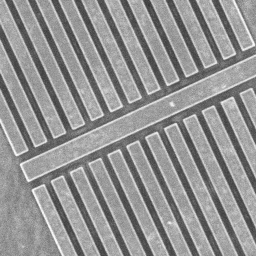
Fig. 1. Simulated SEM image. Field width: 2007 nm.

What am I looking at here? groups of lines, slits or small figures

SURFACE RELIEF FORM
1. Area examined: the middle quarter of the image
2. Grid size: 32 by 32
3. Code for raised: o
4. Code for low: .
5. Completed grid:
.ooo..oooo..oooo..ooo...ooo..ooo
.oooo..ooo...ooo..oooo..oooo..oo
..ooo..oooo..oooo..ooo...ooo..oo
..oooo..ooo...ooo..oooo..ooo....
..oooo..oooo..ooo...ooo..ooo....
o..ooo...ooo..oooo..oooo.......o
o..oooo..oooo..ooo...oo......ooo
oo..ooo...ooo..oooo........ooooo
oo..oooo..oooo..ooo......ooooooo
ooo..ooo..oooo..o......ooooooooo
ooo..oooo..ooo......oooooooooooo
oooo..ooo...o.....oooooooooooo..
.ooo..oooo......oooooooooooo....
.oooo..o......ooooooooooo......o
.oooo.......ooooooooooo.......oo
..oo......ooooooooooo......o..oo
........ooooooooooo......oooo..o
.....oooooooooooo.....oo..ooo..o
...ooooooooooo.......ooo..oooo..
.ooooooooooo.........ooo...ooo..
oooooooooo......ooo..oooo..oooo.
oooooooo........oooo..ooo...ooo.
oooooo.....ooo...ooo..oooo..oooo
oooo.......oooo..oooo..ooo..oooo
oo.....ooo..ooo..oooo..oooo..ooo
......oooo..oooo..ooo...ooo..ooo
...oo..ooo...ooo..oooo..oooo..oo
..ooo..oooo..oooo..ooo...ooo..oo
..oooo..ooo...ooo..oooo..oooo..o
...ooo..oooo..oooo..ooo...ooo..o
o..oooo..ooo..oooo..oooo..oooo..
o...ooo..oooo..ooo...ooo..oooo..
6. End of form